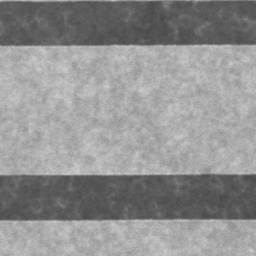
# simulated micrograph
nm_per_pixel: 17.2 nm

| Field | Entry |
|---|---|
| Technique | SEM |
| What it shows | one or a few lines or trenches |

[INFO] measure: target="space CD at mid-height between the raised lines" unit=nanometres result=796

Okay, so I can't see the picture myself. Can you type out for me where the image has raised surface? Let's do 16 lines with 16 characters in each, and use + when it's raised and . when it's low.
................
................
................
++++++++++++++++
++++++++++++++++
++++++++++++++++
++++++++++++++++
++++++++++++++++
++++++++++++++++
++++++++++++++++
++++++++++++++++
................
................
................
++++++++++++++++
++++++++++++++++